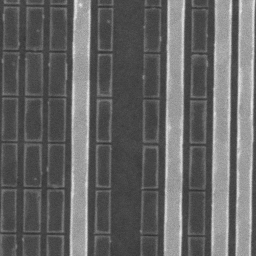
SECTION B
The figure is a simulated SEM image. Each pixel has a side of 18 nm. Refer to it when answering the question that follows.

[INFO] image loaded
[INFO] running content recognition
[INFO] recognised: wiring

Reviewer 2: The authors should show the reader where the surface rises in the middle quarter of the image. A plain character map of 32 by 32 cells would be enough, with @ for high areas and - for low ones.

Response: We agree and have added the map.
--@@@@---@@@--------@@@@--@@@@--
--@@@@---@@@--------@@@@--@@@---
--@@@@---@@@--------@@@@--@@@---
--@@@@---@@@--------@@@@--@@@---
--@@@@---@@@--------@@@@--@@@---
--@@@@---@@@--------@@@@--@@@@--
--@@@@---@@@--------@@@@--@@@@--
--@@@@---@@@--------@@@@--@@@@--
--@@@@--------------------@@@@--
--@@@@---@@@--------@@@@--@@@@--
--@@@@---@@@--------@@@@--@@@@--
--@@@@---@@@--------@@@@--@@@@--
--@@@@---@@@--------@@@@--@@@@--
--@@@@--@@@@--------@@@@--@@@@--
--@@@@--@@@---------@@@@--@@@@--
--@@@@--@@@---------@@@@--@@@@--
--@@@@--@@@---------@@@---@@@---
--@@@@--@@@---------@@@---@@@---
--@@@@--@@@---------@@@---@@@---
--@@@@--------------------@@@---
--@@@@---@@@--------------@@@---
--@@@@--@@@@--------@@@---@@@---
--@@@@--@@@@--------@@@---@@@---
--@@@@--@@@---------@@@---@@@---
--@@@@--@@@---------@@@---@@@---
--@@@@--@@@---------@@@---@@@---
--@@@@--@@@---------@@@---@@@---
--@@@@--@@@---------@@@---@@@---
--@@@@--@@@---------@@@---@@@--@
--@@@@--@@@---------@@@---@@@--@
--@@@----@@---------@@@---@@@--@
--@@@---------------------@@@---